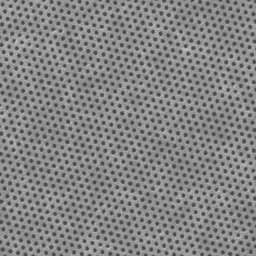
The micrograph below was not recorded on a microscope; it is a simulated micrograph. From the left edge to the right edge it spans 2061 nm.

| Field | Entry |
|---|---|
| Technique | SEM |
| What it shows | a regular array of holes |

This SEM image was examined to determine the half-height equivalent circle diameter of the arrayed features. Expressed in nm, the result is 35.2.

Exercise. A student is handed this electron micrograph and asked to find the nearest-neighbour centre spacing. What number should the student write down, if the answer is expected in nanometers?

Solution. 59.9